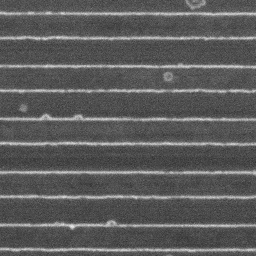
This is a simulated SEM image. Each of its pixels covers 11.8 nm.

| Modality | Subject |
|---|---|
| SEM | lines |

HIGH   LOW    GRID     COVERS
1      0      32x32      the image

00000000000000000000000000000000
00000000000000000000000000000000
11111111111111111111111111111111
11111111111111111111111111111111
11111111111111111111111111111111
00000000000000000000000000000000
00000000000000000000000000000000
00000000000000000000000000000000
11111111111111111111111111111111
11111111111111111111111111111111
11111111111111111111111111111111
00000000000000000000000000000000
00000000000000000000000000000000
00000000000000000000000000000000
00000000000000000000000000000000
11111111111111111111111111111111
11111111111111111111111111111111
11111111111111111111111111111111
00000000000000000000000000000000
00000000000000000000000000000000
00000000000000000000000000000000
00000000000000000000000000000000
11111111111111111111111111111111
11111111111111111111111111111111
11111111111111111111111111111111
00000000000000000000000000000000
00000000000000000000000000000000
00000000000000000000000000000000
11111111111111111111111111111111
11111111111111111111111111111111
11111111111111111111111111111111
00000000000000000000000000000000